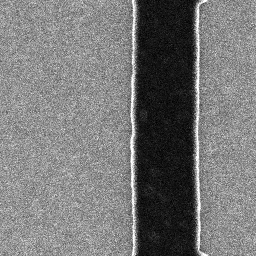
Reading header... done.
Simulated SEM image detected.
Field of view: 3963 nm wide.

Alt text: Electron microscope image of one or a few lines or trenches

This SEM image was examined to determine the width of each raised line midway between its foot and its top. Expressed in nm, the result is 1020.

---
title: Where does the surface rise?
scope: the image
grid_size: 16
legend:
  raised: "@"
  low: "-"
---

--------@@@@@---
--------@@@@----
--------@@@@----
--------@@@@----
--------@@@@----
--------@@@@----
--------@@@@----
--------@@@@----
--------@@@@----
--------@@@@----
--------@@@@----
--------@@@@----
--------@@@@----
--------@@@@----
--------@@@@----
--------@@@@@---